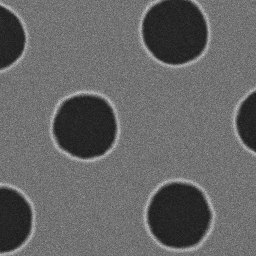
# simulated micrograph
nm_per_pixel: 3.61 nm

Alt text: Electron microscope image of holes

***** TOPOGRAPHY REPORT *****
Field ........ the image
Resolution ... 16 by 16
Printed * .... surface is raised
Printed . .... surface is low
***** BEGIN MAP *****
*********...****
.********....***
..*******....***
.*********..****
****************
****************
****...********.
***....********.
***....********.
****...*********
****************
**********..****
..*******....***
..*******....***
..*******....***
.***************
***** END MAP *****